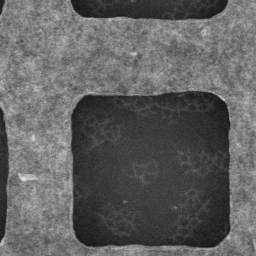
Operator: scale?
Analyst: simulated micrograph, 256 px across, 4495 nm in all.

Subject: holes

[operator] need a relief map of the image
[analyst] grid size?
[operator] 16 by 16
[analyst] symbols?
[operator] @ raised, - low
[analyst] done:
@@@@@---------@@
@@@@@@@@@@@@@@@@
@@@@@@@@@@@@@@@@
@@@@@@@@@@@@@@@@
@@@@@@@@@@@@@@@@
@@@@@@@@@@@@@@@@
@@@@@---------@@
@@@@----------@@
-@@@----------@@
-@@@----------@@
-@@@----------@@
@@@@----------@@
@@@@@---------@@
@@@@@---------@@
@@@@@---------@@
@@@@@@@@@-@@@@@@